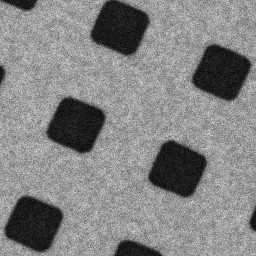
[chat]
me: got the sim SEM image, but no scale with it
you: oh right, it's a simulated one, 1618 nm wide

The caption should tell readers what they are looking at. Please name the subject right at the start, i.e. holes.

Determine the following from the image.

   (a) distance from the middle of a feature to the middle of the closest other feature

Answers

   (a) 674 nm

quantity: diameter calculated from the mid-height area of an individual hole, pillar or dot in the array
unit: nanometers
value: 342